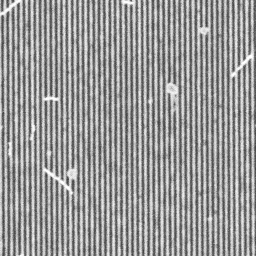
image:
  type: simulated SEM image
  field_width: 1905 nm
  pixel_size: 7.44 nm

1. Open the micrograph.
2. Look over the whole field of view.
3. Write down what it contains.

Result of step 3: parallel lines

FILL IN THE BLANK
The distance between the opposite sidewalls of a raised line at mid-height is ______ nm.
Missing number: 14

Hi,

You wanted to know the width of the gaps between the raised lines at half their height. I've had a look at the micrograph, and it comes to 26 nm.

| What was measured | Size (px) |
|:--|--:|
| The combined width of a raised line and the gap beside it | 5.38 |